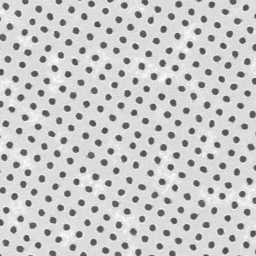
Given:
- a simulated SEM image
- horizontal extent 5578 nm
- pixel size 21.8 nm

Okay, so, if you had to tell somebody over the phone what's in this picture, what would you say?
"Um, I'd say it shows a regular array of holes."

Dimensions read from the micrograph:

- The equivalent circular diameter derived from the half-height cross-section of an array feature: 161 nm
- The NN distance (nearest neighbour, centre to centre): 301 nm